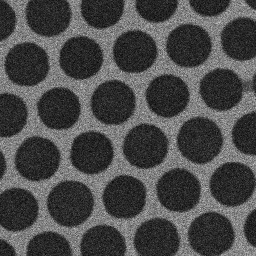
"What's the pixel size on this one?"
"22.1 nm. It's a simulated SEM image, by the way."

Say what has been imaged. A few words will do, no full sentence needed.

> a regular array of holes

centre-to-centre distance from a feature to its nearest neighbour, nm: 1200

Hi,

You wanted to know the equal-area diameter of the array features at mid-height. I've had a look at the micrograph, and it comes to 987 nm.